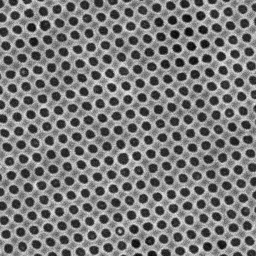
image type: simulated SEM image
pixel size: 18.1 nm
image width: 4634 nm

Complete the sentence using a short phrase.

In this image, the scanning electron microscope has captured a regular array of holes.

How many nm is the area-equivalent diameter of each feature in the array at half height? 182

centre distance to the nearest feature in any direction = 251 nm